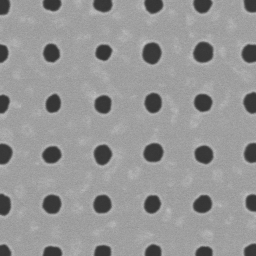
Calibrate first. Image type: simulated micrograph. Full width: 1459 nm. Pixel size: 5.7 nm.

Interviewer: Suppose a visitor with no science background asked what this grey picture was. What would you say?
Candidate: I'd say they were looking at a regular array of holes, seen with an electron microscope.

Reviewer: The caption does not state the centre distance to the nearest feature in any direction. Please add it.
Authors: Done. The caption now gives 282 nm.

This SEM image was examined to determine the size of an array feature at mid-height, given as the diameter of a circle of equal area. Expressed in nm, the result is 106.